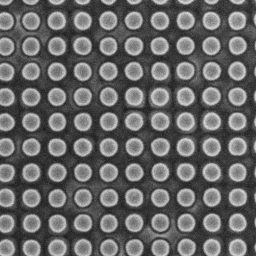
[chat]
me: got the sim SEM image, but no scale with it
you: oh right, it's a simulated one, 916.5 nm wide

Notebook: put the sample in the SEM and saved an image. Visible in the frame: a regular array of raised bodies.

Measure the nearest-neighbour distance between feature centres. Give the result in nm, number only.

90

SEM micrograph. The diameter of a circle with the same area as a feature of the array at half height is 0.062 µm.